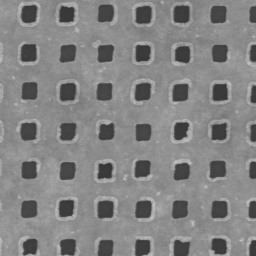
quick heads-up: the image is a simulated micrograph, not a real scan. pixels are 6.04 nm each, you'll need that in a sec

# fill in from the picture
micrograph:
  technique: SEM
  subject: a regular array of holes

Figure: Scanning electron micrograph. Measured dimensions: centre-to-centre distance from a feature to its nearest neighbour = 225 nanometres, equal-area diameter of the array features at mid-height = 0.107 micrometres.